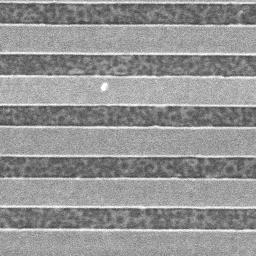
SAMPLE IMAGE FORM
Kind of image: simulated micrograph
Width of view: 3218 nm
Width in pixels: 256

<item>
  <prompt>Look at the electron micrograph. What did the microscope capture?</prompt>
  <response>parallel lines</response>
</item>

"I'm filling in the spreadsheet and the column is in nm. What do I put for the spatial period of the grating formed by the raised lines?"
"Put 644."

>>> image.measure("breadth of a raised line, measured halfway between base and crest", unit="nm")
366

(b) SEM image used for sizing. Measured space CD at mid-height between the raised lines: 284 nm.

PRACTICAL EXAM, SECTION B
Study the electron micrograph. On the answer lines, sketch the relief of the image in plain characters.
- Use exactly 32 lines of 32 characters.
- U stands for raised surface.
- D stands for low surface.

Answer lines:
DDDDDDDDDDDDDDDDDDDDDDDDDDDDDDDD
DDDDDDDDDDUDDDDDDDDDDDDDDDDDDDDD
DDDDDDDDDDDDDDDDDDDDDDDDDDDDDDDD
UUUUUUUUUUUUUUUUUUUUUUUUUUUUUUUU
UUUUUUUUUUUUUUUUUUUUUUUUUUUUUUUU
UUUUUUUUUUUUUUUUUUUUUUUUUUUUUUUU
UUUUUUUUUUUUUUUUUUUUUUUUUUUUUUUU
DDDDDDDDDDDDDDDDDDDDDDDDDDDDDDDD
DDDDDDDDDDDDDDDUDDDDDDDDDDDDDDDD
DDDDDDDDUUUDDDUUDDDDDDUDDDDDDDDD
UUUUUUUUUUUUUUUUUUUUUUUUUUUUUUUU
UUUUUUUUUUUUUUUUUUUUUUUUUUUUUUUU
UUUUUUUUUUUUUUUUUUUUUUUUUUUUUUUU
DDDDDDDDDDDDDDDDDDDDDDDDDDDDDDDD
DDDDDDDDDDDDDDDDDDDDDDDDDDDDDDDD
DDDDDDDDDDDDDDDDDDDDDDDDDDDDDDDD
UUUUUUUUUUUUUUUUUUUUUUUUUUUUUUUU
UUUUUUUUUUUUUUUUUUUUUUUUUUUUUUUU
UUUUUUUUUUUUUUUUUUUUUUUUUUUUUUUU
DDDDDDDDDDDDUUUUUUUUUUUUUUUUUUUU
DDDDDDDDDDDDDDDUDDDDDDDDDDDDDDDD
DDDDDDDDDDDDDDDDDDDDDDDDDDDDUDDD
UUUUUUUUUUUUUUUUUUUUUUUUUUUUUUUU
UUUUUUUUUUUUUUUUUUUUUUUUUUUUUUUU
UUUUUUUUUUUUUUUUUUUUUUUUUUUUUUUU
UUUUUUUUUUUUUUUUUUUUUUUUUUUUUUUU
DDDDDDDDDDDDDDDDDDDDDUUDDDDDDDDD
DDDDDDDDDDDDDDDDDDDDDDDDDUDDDDDD
DDDDDDDDDDDDDDDDDDDDDDDDDDDDDDDD
UUUUUUUUUUUUUUUUUUUUUUUUUUUUUUUU
UUUUUUUUUUUUUUUUUUUUUUUUUUUUUUUU
UUUUUUUUUUUUUUUUUUUUUUUUUUUUUUUU